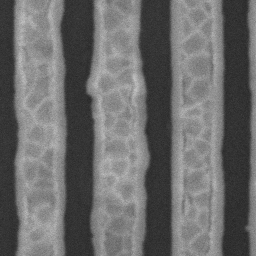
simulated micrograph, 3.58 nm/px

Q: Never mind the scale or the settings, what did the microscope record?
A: one or a few lines or trenches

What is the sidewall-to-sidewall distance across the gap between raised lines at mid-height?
135 nm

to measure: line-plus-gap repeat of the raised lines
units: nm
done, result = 282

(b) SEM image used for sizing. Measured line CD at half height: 41.2 px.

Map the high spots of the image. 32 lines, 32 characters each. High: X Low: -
--XXXXX-----XXXXX-----XXXXX-----
--XXXXX-----XXXXX-----XXXXX-----
--XXXXX-----XXXXX-----XXXXX-----
--XXXXX-----XXXXX-----XXXXX-----
--XXXXX-----XXXXX-----XXXXX-----
--XXXXX-----XXXXX-----XXXXX-----
--XXXXX-----XXXXX-----XXXXX-----
--XXXXX-----XXXXX-----XXXXX-----
--XXXXX-----XXXXX-----XXXXX-----
--XXXXX-----XXXXX-----XXXXX-----
--XXXXX-----XXXXXX----XXXXX-----
--XXXXX-----XXXXX-----XXXXX-----
--XXXXX-----XXXXX-----XXXXX-----
--XXXXX-----XXXXX-----XXXXX-----
---XXXX-----XXXXX-----XXXXX-----
---XXXX-----XXXXX-----XXXXX-----
---XXXXX----XXXXX-----XXXXX-----
---XXXXX----XXXXXX----XXXXX-----
---XXXXX----XXXXXX----XXXXX-----
---XXXX-----XXXXXX----XXXXX-----
--XXXXX-----XXXXXX----XXXXX-----
--XXXXX-----XXXXX-----XXXXX-----
---XXXX-----XXXXX-----XXXXX-----
---XXXX-----XXXXX-----XXXXX-----
---XXXXX----XXXXX-----XXXXX-----
---XXXXX----XXXXXX----XXXXX-----
---XXXXX----XXXXXX----XXXXX-----
---XXXX-----XXXXXX----XXXXX-----
---XXXX-----XXXXX-----XXXXX-----
---XXXX-----XXXXX-----XXXXX-----
---XXXX-----XXXXX-----XXXXX-----
---XXXX-----XXXXX-----XXXXX-----